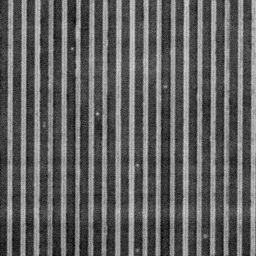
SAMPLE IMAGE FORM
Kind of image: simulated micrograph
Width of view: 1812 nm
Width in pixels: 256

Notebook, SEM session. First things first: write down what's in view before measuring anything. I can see parallel lines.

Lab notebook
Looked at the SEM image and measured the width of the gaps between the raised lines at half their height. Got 68.2 nm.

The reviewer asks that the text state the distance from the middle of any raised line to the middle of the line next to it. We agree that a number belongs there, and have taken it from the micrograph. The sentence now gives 0.0958 microns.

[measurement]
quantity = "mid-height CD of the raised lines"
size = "0.0274 micrometres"